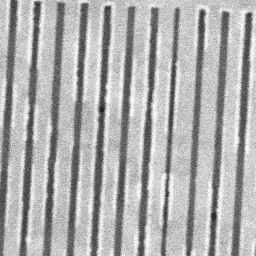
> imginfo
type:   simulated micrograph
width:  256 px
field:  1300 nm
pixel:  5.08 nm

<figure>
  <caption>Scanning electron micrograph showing parallel lines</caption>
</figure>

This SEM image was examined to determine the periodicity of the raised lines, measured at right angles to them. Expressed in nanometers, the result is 119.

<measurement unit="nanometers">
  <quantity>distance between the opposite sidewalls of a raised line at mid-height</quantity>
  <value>80.5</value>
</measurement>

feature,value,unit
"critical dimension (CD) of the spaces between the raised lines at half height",39.9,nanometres